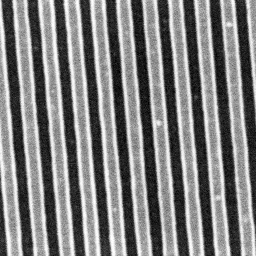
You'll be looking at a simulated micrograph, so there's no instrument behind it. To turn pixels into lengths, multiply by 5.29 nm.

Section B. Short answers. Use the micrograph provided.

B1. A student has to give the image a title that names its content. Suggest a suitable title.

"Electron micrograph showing parallel lines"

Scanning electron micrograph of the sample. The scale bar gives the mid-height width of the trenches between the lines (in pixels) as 13.3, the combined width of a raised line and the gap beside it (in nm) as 137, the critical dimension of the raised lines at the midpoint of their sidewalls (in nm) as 65.9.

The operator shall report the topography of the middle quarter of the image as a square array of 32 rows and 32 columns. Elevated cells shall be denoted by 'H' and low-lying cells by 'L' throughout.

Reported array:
LLHHHLLLHHHLLLLHHHLLLHHHLLLLHHHL
LLHHHLLLHHHHLLLHHHLLLHHHLLLLHHHL
LLHHHLLLHHHHLLLHHHLLLHHHLLLLHHHL
LLHHHLLLLHHHLLLHHHLLLHHHLLLLHHHL
LLHHHLLLLHHHLLLHHHLLLLHHLLLLHHHL
LLHHHLLLLHHHLLLHHHLLLLHHHLLLHHHL
LLHHHLLLLHHHLLLHHHLLLLHHHLLLHHHL
LLHHHLLLLHHHLLLHHHLLLLHHHLLLHHHL
LLHHHLLLLHHHLLLHHHHLLLHHHLLLHHHH
LLLHHLLLLHHHLLLLHHHLLLHHHLLLHHHH
LLLHHHLLLHHHLLLLHHHLLLHHHLLLLHHL
LLLHHHLLLHHHLLLLHHHLLLHHHLLLLHHH
LLLHHHLLLHHHLLLLHHHLLLHHHLLLLHHH
LLLHHHLLLHHHLLLLHHHLLLHHHLLLLHHH
LLLHHHLLLHHHLLLLHHHLLLHHHLLLLHHH
LLLHHHLLLLHHLLLLHHHLLLHHHHLLLHHH
LLLHHHLLLLHHHLLLHHHLLLLHHLLLLHHH
LLLHHHLLLLHHHLLLHHHLLLLHHHLLLHHH
LLLHHHLLLLHHHLLLHHHLLLLHHHLLLHHH
LLLHHHHLLLHHHLLLHHHLLLLHHHLLLHHH
LLLHHHLLLLHHHLLLHHHLLLLHHHLLLHHH
LLLLHHHLLLHHHLLLLHHLLLLHHHLLLHHH
LLLLHHHLLLHHHLLLLHHHLLLHHHLLLLHH
LLLLHHHLLLHHHLLLLHHHLLLHHHLLLLHH
LLLLHHHLLLHHHLLLLHHHLLLHHHLLLLHH
LLLLHHHLLLHHHHLLLHHHLLLHHHLLLLHH
LLLLHHHLLLHHHHLLLHHHLLLHHHLLLLHH
HLLLHHHLLLLHHHLLLHHHLLLHHHLLLLHH
HLLLHHHLLLLHHHLLLHHHLLLLHHHLLLHH
HLLLHHHLLLLHHHLLLHHHLLLLHHHLLLHH
HLLLHHHLLLLHHHLLLHHHLLLLHHHLLLHH
HLLLHHHLLLLHHHLLLHHHLLLLHHHLLLLH